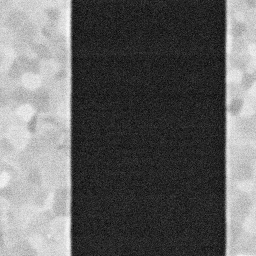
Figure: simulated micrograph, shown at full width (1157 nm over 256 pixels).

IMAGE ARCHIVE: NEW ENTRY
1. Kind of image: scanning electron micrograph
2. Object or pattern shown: wiring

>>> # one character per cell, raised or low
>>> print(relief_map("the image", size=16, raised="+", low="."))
++++..........++
++++..........++
++++..........++
++++..........++
++++..........++
++++..........++
++++..........++
++++..........++
++++..........++
++++..........++
++++..........++
++++..........++
++++..........++
++++..........++
++++..........++
++++..........++